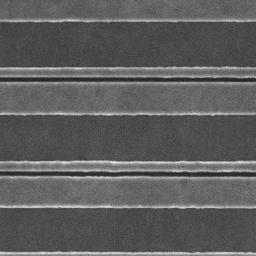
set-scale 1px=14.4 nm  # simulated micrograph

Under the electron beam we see lines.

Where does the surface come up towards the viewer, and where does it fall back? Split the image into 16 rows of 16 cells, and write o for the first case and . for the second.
oooooooooooooooo
................
................
................
oooooooooooooooo
oooooooooooooooo
oooooooooooooooo
................
................
................
oooooooooooooooo
oooooooooooooooo
oooooooooooooooo
................
................
................